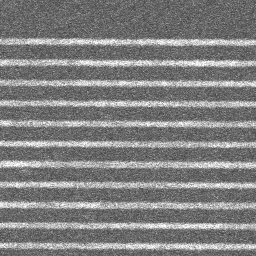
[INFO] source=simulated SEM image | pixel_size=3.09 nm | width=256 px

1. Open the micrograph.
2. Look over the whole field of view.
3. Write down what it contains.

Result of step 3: parallel lines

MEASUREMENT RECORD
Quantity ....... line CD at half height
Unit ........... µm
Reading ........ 0.0139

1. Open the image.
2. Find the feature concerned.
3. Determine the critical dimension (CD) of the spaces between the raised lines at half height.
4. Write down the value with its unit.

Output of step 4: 50.7 nm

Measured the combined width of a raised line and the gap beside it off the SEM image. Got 0.0632 microns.